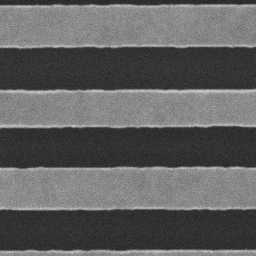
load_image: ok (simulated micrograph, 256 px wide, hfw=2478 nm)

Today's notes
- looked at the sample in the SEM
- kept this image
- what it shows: lines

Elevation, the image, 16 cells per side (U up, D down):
UUUUUUUUUUUUUUUU
UUUUUUUUUUUUUUUU
UUUUUUUUUUUUUUUU
DDDDDDDDDDDDDDDD
DDDDDDDDDDDDDDDD
DDDDDDDDDDDDDDDD
UUUUUUUUUUUUUUUU
UUUUUUUUUUUUUUUU
DDDDDDDDDDDDDDDD
DDDDDDDDDDDDDDDD
DDUDDDDUUUUUUUUU
UUUUUUUUUUUUUUUU
UUUUUUUUUUUUUUUU
DDDDDDDDDDDDDDDD
DDDDDDDDDDDDDDDD
DDDDDDDDDDDDDDDD